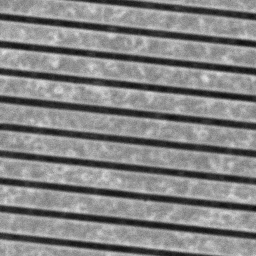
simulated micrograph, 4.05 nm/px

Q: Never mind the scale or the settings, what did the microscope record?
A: parallel lines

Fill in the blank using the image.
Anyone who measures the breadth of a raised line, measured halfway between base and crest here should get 80.6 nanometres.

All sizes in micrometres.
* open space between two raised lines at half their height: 0.0297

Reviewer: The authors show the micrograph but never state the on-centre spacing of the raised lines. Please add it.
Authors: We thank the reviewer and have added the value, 0.11 um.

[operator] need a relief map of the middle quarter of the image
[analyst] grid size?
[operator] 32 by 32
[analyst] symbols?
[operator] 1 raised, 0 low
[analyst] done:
11111111111111111111111110000000
11111111111111111111111111111111
01111111111111111111111111111111
00000000001111111111111111111111
00000000000000000001111111111111
11111111000000000000000000111111
11111111111111111000000000000000
11111111111111111111111111000000
11111111111111111111111111111111
01111111111111111111111111111111
00000000000111111111111111111111
00000000000000000001111111111111
11111111100000000000000000001111
11111111111111111110000000000000
11111111111111111111111111110000
11111111111111111111111111111111
00111111111111111111111111111111
00000000000111111111111111111111
11000000000000000000111111111111
11111111111000000000000000000111
11111111111111111111000000000000
11111111111111111111111111111100
11111111111111111111111111111111
00011111111111111111111111111111
00000000000001111111111111111111
11100000000000000000001111111111
11111111111110000000000000000001
11111111111111111111110000000000
11111111111111111111111111111110
11111111111111111111111111111111
00000111111111111111111111111111
00000000000000111111111111111111